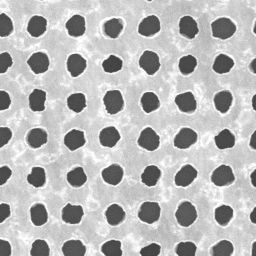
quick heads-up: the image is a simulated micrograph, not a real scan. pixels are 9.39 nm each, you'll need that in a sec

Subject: a regular array of holes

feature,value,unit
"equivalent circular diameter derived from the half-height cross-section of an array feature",198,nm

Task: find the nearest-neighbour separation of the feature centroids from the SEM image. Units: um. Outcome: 0.338